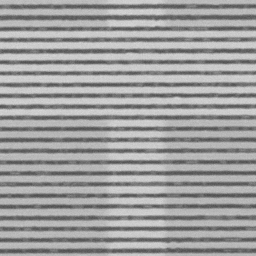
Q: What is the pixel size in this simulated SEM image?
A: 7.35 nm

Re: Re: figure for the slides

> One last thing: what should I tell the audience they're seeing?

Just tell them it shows parallel lines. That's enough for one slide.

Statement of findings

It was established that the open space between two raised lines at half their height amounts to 33.1 nm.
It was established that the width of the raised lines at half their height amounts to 45.9 nanometres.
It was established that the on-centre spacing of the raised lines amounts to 81.7 nm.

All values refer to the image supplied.